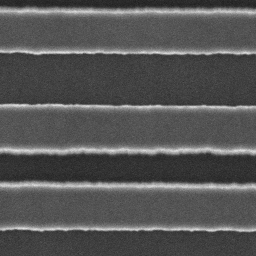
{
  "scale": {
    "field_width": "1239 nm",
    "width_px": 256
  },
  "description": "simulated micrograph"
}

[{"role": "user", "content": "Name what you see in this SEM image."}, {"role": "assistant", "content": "lines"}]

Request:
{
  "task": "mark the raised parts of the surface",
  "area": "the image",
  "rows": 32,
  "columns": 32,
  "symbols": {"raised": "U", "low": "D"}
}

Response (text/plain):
DDDDDDDDDDDDDDDDDDDDDDDDDDDDDDDD
UUUUUUUUUUUUUUUDUUUUUUUUUUUUUUUD
UUUUUUUUUUUUUUUUUUUUUUUUUUUUUUUU
UUUUUUUUUUUUUUUUUUUUUUUUUUUUUUUU
UUUUUUUUUUUUUUUUUUUUUUUUUUUUUUUU
UUUUUUUUUUUUUUUUUUUUUUUUUUUUUUUU
UUUUUUUUUUUUUUUUUUUUUUUUUUUUUUUU
DDDDDDDDDDDDDDDDDDDDDDDDDDDDDDDD
DDDDDDDDDDDDDDDDDDDDDDDDDDDDDDDD
DDDDDDDDDDDDDDDDDDDDDDDDDDDDDDDD
DDDDDDDDDDDDDDDDDDDDDDDDDDDDDDDD
DDDDDDDDDDDDDDDDDDDDDDDDDDDDDDDD
DDDDDDDDDDDDDDDDDDDDDDDDDDDDDDDD
UUUUUUUUUUUUUUUUUUUUUUUUUUUUUUUU
UUUUUUUUUUUUUUUUUUUUUUUUUUUUUUUU
UUUUUUUUUUUUUUUUUUUUUUUUUUUUUUUU
UUUUUUUUUUUUUUUUUUUUUUUUUUUUUUUU
UUUUUUUUUUUUUUUUUUUUUUUUUUUUUUUU
UUUUUUUUUUUUUUUUUUUUUUUUUUUUUUUU
DDDDDDDDDDDDDDDDDDDDDDDDDDDDDDDD
DDDDDDDDDDDDDDDDDDDDDDDDDDDDDDDD
DDDDDDDDDDDDDDDDDDDDDDDDDDDDDDDD
DDDDDDDDDDDDDDDDDDDDDDDDDDDDDDDD
UUUUUUUUUUUUUUUUUUUUUUUUUUUUUUUU
UUUUUUUUUUUUUUUUUUUUUUUUUUUUUUUU
UUUUUUUUUUUUUUUUUUUUUUUUUUUUUUUU
UUUUUUUUUUUUUUUUUUUUUUUUUUUUUUUU
UUUUUUUUUUUUUUUUUUUUUUUUUUUUUUUU
UUUUUUUUUUUUUUUUUUUUUUUUUUUUUUUU
DDDDDDDDDDDDDDDDDDDDDDDDDDDDDDDD
DDDDDDDDDDDDDDDDDDDDDDDDDDDDDDDD
DDDDDDDDDDDDDDDDDDDDDDDDDDDDDDDD